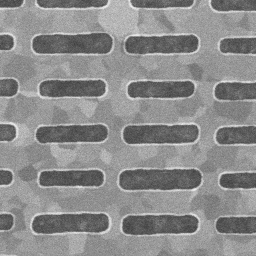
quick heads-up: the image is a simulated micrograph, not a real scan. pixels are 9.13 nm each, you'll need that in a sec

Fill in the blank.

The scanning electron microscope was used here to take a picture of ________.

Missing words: a regular array of holes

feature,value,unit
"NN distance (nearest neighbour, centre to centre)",409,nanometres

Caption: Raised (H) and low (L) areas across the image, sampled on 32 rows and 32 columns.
LLLHHLLLLLLLLHHHLLLLLLLLHHLLLLLL
HHHHHHHHHHHHHHHHHHHHHHHHHHHHHLLL
HHHHHHHHHHHHHHHHHHHHHHHHHHHHHHHH
HHHHHHHHHHHHHHHHHHHHHHHHHHHHHHHH
LLHHHLLLLLLLLLHHLLLLLLLLLHHHHHHH
LLHHLLLLLLLLLLHHLLLLLLLLLHHLLLLL
HHHHLLLLLLLLLLHHLLLLLLLLHHHHLLLL
HHHHHHHHHHHHHHHHHHHHHHHHHHHHHHHH
HHHHHHHHHHHHHHHHHHHHHHHHHHHHHHHH
HHHHHHHHHHHHHHHHHHHHHHHHHHHHHHHH
LLHHHLLLLLLLLHHHLLLLLLLLHHHLLLLL
LLHHHLLLLLLLLHHHLLLLLLLLHHHLLLLL
HHHHHHHHHHHHHHHHHHHHHHHHHHHLLLLL
HHHHHHHHHHHHHHHHHHHHHHHHHHHHHHHH
HHHHHHHHHHHHHHHHHHHHHHHHHHHHHHHH
LHHHHHHHHHHLLHHHHHHLHHHLHHHHHHHH
LLHHLLLLLLLLLLHLLLLLLLLLLHHLLLLL
LLHHHLLLLLLLLHHLLLLLLLLLLHHLLLLL
HHHHHHHHHHHHHHHHHHHHHHHHHHHHHHHH
HHHHHHHHHHHHHHHHHHHHHHHHHHHHHHHH
HHHHHHHHHHHHHHHHHHHHHHHHHHHHHHHH
LHHHHLLLLLLLLHHLLLLLLLLLLHHHHLLL
LLHHHLLLLLLLLHHLLLLLLLLLLHHLLLLL
HHHHHHHHHHHHHHHLLLLLLLLLLHHHLLLL
HHHHHHHHHHHHHHHHHHHHHHHHHHHHHHHH
HHHHHHHHHHHHHHHHHHHHHHHHHHHHHHHH
HHHHHHHHHHLHHHHHHHHHHHHHHHHHHHHH
LLHHLLLLLLLLLLHLLLLLLLLLLHHLLLLL
LHHHLLLLLLLLLLHLLLLLLLLLLHHLLLLL
HHHHHHHHHHHHHHHHHLHHHHHHHHHHHHHH
HHHHHHHHHHHHHHHHHHHHHHHHHHHHHHHH
HHHHHHHHHHHHHHHHHHHHHHHHHHHHHHHH